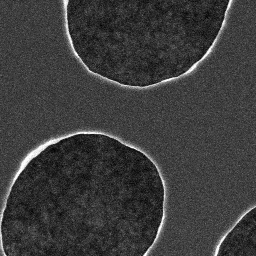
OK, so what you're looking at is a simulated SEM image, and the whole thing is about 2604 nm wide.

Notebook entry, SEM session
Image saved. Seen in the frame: holes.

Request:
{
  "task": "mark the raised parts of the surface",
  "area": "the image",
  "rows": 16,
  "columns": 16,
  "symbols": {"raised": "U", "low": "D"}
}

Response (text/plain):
UUUUDDDDDDDDDDUU
UUUUDDDDDDDDDDUU
UUUUDDDDDDDDDUUU
UUUUUDDDDDDDDUUU
UUUUUUDDDDDDUUUU
UUUUUUUUUUUUUUUU
UUUUUUUUUUUUUUUU
UUUUUUUUUUUUUUUU
UUUUDDDUUUUUUUUU
UUDDDDDDDUUUUUUU
UDDDDDDDDDUUUUUU
UDDDDDDDDDUUUUUU
DDDDDDDDDDUUUUUU
DDDDDDDDDDUUUUUD
DDDDDDDDDDUUUUDD
DDDDDDDDDUUUUUDD